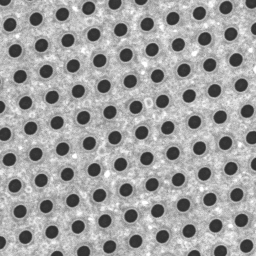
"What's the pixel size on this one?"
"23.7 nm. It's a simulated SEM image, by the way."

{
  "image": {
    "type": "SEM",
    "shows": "a regular array of holes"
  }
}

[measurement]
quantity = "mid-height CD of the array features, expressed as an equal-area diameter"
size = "322 nanometers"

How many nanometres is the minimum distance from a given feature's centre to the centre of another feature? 620